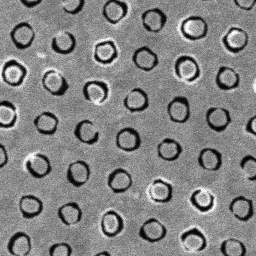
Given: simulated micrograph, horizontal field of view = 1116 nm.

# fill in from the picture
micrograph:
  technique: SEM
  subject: a regular array of ring-shaped grooves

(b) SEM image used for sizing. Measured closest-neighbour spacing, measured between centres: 171 nanometres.